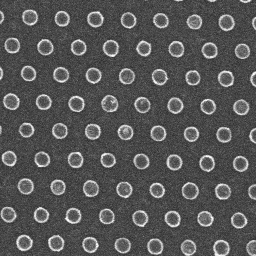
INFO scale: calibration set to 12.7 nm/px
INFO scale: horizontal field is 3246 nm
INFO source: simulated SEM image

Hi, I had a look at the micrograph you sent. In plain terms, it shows a regular array of raised bodies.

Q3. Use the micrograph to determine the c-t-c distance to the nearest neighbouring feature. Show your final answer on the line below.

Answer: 0.407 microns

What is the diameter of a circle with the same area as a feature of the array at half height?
191 nm